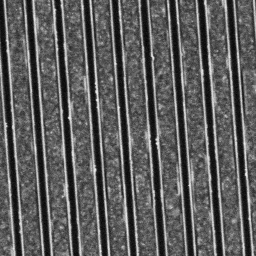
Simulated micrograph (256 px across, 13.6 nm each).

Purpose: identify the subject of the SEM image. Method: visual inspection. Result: parallel lines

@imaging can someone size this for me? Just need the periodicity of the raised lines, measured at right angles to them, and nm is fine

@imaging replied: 388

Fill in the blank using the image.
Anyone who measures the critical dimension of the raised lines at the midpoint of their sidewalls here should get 132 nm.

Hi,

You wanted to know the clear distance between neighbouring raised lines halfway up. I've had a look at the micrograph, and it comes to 264 nm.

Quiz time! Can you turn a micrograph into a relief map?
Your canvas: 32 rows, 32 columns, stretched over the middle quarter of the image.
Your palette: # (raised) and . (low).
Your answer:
#.....##.....##.....##.....##...
#.....##.....##.....##.....##...
#.....##.....##.....##.....##...
#.....##.....##.....##.....##...
#.....##.....##.....##......##..
#.....##.....##.....###.....##..
#.....##.....###....###.....##..
#.....##.....###....###.....##..
#.....##.....###.....##.....##..
#.....##......##.....##.....##..
#......##.....##.....##.....##..
##....###.....##.....##.....##..
##....###.....##.....##.....##..
##....###.....##.....##.....##..
##.....##.....##.....##.....##..
##.....##.....##.....##.....##..
##.....##.....##.....##.....##..
##.....##.....##.....##......##.
##.....##.....##.....###.....##.
##.....##.....###....###.....##.
##.....##.....###....###.....##.
##.....##.....###....###.....##.
##.....##.....###.....##.....##.
##.....##......##.....##.....##.
##.....###.....##.....##.....##.
###....###.....##.....##.....##.
###....###.....##.....##.....##.
###.....##.....##.....##.....##.
.##.....##.....##.....##.....##.
.##.....##.....##.....##.....##.
.##.....##.....##.....##.....##.
.##.....##.....##.....##......##